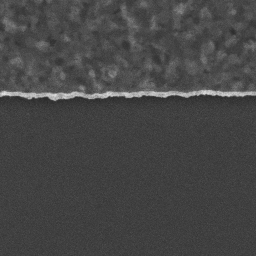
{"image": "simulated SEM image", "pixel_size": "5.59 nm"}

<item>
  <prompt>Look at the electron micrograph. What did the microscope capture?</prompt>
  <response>one or a few lines or trenches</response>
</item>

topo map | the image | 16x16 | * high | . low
****************
****************
****************
****************
****************
****************
................
................
................
................
................
................
................
................
................
................